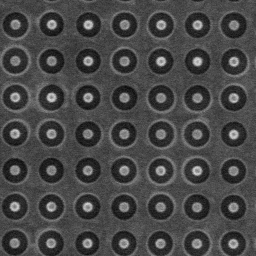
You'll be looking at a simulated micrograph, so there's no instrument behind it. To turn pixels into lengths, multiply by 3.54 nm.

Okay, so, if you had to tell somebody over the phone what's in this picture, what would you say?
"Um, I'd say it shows an array of small figures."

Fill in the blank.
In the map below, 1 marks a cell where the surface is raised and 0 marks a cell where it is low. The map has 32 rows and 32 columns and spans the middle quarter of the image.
11100000011100000011100000011100
11110000111110000011110000011110
11111111111111001111111000111111
11111111111111111111111111111111
11111111111111111111111111111111
11110000111111000111110000111111
11100000011110000011100000011110
11100000011100010011100000001100
11100110011100110011100110001100
11100000011100010011100010001100
11110000111110000011100000011100
11111001111111001111110000111110
11111111111111111111111111111111
11111111111111111111111111111111
11111001111111001111111000111110
11100000011100000011110000011100
11100000011100000011100000001100
11000110001000110011100110001100
11100100011100000011100010001100
11100000011100000011100000011100
11111001111110000111110000111110
11111111111111111111111111111111
11111111111111111111111111111111
11111001111110000111111000111111
11110000011100000011110000011100
11100000011100000011100000001100
11100110011100110011100110001100
11100110011100110011100110001100
11100000011100000011100000011100
11110000111110000111110000111110
11111111111111111111111111111111
11111111111111111111111111111111